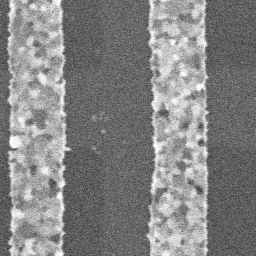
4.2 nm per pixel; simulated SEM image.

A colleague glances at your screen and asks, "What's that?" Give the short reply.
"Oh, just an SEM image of one or a few lines or trenches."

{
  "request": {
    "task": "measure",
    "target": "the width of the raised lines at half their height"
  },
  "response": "217 nanometers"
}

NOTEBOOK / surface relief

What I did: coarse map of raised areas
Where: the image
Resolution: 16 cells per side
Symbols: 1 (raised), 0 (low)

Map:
0111000001111000
0111000001111000
0111000001111000
0111000001111000
0111000000111000
0111000000111000
0111000000111000
0111000000111000
0111000000111000
0111000000111000
0111000000111000
0111000000111000
0111000000111000
0111000001111000
0111000001111000
0111000001111000